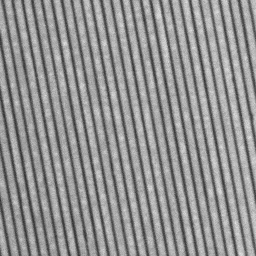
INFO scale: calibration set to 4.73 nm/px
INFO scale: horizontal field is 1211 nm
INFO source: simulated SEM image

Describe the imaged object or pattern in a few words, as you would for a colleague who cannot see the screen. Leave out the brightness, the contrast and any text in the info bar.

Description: parallel lines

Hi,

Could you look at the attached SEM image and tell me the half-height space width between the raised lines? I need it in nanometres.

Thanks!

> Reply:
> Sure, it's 13.4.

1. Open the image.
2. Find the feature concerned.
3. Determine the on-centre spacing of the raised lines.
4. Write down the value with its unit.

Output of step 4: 45.9 nm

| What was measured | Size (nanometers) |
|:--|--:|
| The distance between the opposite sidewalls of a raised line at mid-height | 30.9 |